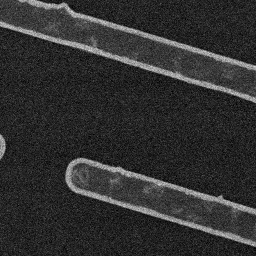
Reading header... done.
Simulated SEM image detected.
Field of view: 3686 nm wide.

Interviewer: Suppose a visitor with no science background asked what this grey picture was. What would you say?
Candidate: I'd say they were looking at one or a few lines or trenches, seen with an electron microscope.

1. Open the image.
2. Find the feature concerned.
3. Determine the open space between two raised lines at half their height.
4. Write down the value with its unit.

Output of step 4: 107 px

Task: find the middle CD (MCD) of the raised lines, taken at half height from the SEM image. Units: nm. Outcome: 456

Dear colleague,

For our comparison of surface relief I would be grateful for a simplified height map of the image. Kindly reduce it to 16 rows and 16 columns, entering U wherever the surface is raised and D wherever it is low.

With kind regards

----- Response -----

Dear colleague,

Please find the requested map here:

UUUUDDDDDDDDDDDD
UUUUUUUDDDDDDDDD
DDDUUUUUUUDDDDDD
DDDDDDDUUUUUUUDD
DDDDDDDDDDUUUUUU
DDDDDDDDDDDDDDUU
DDDDDDDDDDDDDDDD
DDDDDDDDDDDDDDDD
DDDDDDDDDDDDDDDD
DDDDDDDDDDDDDDDD
DDDDUUUDDDDDDDDD
DDDDUUUUUUDDDDDD
DDDDDDDUUUUUUUDD
DDDDDDDDDDUUUUUU
DDDDDDDDDDDDDUUU
DDDDDDDDDDDDDDDD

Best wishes